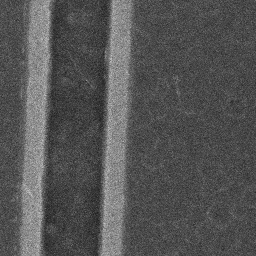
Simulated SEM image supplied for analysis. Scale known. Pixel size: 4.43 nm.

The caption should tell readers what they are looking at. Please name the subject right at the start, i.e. one or a few lines or trenches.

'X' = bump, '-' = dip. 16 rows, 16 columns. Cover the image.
XXX-----XXXXXXXX
XX------XXXXXXXX
XX------XXXXXXXX
XX-----XXXXXXXXX
XX-----XXXXXXXXX
XX-----XXXXXXXXX
XX-----XXXXXXXXX
XX-----XXXXXXXXX
XX-----XXXXXXXXX
XX-----XXXXXXXXX
XX-----XXXXXXXXX
XX-----XXXXXXXXX
XX-----XXXXXXXXX
XX-----XXXXXXXXX
XX-----XXXXXXXXX
XX-----XXXXXXXXX